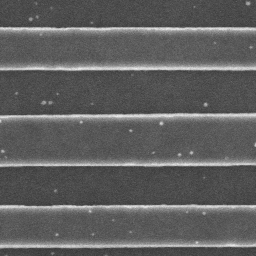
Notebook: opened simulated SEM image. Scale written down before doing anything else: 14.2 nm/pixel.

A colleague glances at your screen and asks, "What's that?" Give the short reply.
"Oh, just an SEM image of lines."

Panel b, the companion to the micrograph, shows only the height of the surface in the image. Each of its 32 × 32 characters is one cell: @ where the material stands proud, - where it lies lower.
--------------------------------
--------------------------------
--------------------------------
--------------------------------
@@@@@@@@@@@@@@@@@@@@@@@@@@@@@@@@
@@@@@@@@@@@@@@@@@@@@@@@@@@@@@@@@
@@@@@@@@@@@@@@@@@@@@@@@@@@@@@@@@
@@@@@@@@@@@@@@@@@@@@@@@@@@@@@@@@
@@@@@@@@@@@@@@@@@@@@@@--@@------
--------------------------------
--------------------------------
--------------------------------
--------------------------------
--------------------------------
-----@--@@@@@@@@@@@@@@@@@@@@@@@@
@@@@@@@@@@@@@@@@@@@@@@@@@@@@@@@@
@@@@@@@@@@@@@@@@@@@@@@@@@@@@@@@@
@@@@@@@@@@@@@@@@@@@@@@@@@@@@@@@@
@@@@@@@@@@@@@@@@@@@@@@@@@@@@@@@@
@@@@@@@@@@@@@@@@@@@@@@@@@@@@@@@@
@@@@@@@@@@@@@@@@@@@@@@@@@@@@@@-@
--------------------------------
--------------------------------
--------------------------------
--------------------------------
--------------------------------
@@@@@@@@@@@@@@@@@@@@@@@@@@@@@@@@
@@@@@@@@@@@@@@@@@@@@@@@@@@@@@@@@
@@@@@@@@@@@@@@@@@@@@@@@@@@@@@@@@
@@@@@@@@@@@@@@@@@@@@@@@@@@@@@@@@
@@@@@@@@@@@@@@@@@@@@@@@@@@@@@@@@
--------------------------------